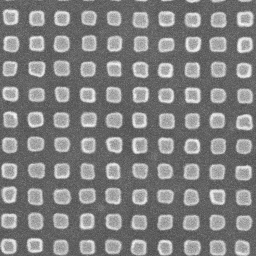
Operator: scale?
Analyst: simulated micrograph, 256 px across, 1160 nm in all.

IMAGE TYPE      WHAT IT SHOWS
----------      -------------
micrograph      a regular array of raised bodies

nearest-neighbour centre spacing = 113 nm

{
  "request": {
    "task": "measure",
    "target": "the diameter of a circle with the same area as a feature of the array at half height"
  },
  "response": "70 nanometers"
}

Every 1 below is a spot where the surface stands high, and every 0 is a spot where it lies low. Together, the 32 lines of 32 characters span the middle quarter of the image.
10001111000111000111100011100011
10001111000111000111100011100011
10001111000111000011100011100011
00000000000000000000000000000000
00000000000000000000000000000000
00000000000000000000000000000000
10001110000111000111100011100001
10001111000111000111100011100011
10001111000111000111100011100011
00000000000011000000000000000000
00000000000000000000000000000000
00000000000000000000000000000000
10000111000001000011000001100000
10000111000111000111000011100011
10000111000111000111000011100011
10000110000111000011000011100011
00000000000000000000000000000000
00000000000000000000000000000000
00000000000000000000000000000000
10000111000111000111100011100001
10000110000111000111100011100011
10000110000011000111100011100011
00000000000000000000000000000000
00000000000000000000000000000000
00000000000000000000000000000000
10001110000111000111100011000001
10001110000111000111100011100011
10001111000111000111000011100011
00000110000111000000000011000001
00000000000000000000000000000000
00000000000000000000000000000000
10001110000111000001000001000001